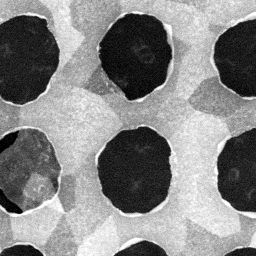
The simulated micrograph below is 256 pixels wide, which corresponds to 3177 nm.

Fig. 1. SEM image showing holes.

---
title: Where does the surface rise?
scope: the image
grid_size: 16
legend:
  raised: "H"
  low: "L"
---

HHHHHHHHHHHHHHHH
LLLHHHHLLLHHHHHL
LLLHHHLLLLLHHHLL
LLLLHHLLLLLHHLLL
LLLHHHHLLLLHHHLL
LLLHHHHLLLHHHHLL
HHHHHHHHHHHHHHHH
HHHHHHHHHHHHHHHH
LLLHHHHLLLHHHHHL
LLLHHHLLLLLHHHLL
LLLLHHLLLLLHHHLL
LLLLHHLLLLLHHHLL
LLLHHHHLLLHHHHLL
HHHHHHHHHHHHHHHH
HHHHHHHHHHHHHHHH
LLHHHHHHLLHHHHHL